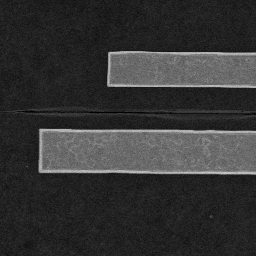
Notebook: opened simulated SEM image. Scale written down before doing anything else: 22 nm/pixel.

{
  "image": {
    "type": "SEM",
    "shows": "wiring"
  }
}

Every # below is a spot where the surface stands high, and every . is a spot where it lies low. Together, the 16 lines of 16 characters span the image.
................
................
................
.......#########
.......#########
................
................
................
...#############
...#############
...#############
................
................
................
................
................